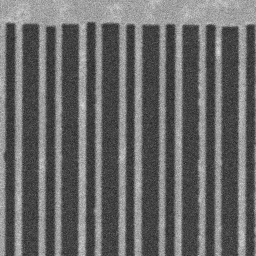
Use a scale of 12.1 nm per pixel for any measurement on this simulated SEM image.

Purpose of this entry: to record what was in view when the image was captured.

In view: parallel lines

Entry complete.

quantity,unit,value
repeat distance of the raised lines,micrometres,0.246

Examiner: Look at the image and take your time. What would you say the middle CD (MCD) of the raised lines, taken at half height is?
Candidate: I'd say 0.0726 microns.